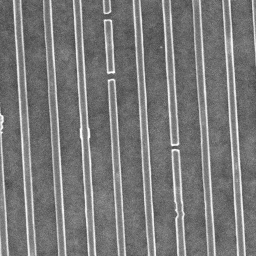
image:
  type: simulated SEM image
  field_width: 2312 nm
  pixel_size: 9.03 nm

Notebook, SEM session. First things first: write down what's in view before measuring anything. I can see parallel lines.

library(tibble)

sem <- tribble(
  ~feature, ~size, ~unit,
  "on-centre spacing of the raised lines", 29.8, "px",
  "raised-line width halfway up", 65.3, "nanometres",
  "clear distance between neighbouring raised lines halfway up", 22.4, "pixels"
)